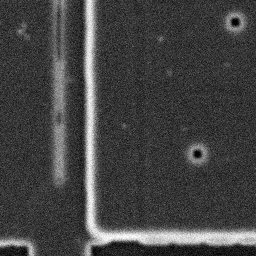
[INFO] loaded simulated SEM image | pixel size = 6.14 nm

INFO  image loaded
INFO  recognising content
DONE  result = wiring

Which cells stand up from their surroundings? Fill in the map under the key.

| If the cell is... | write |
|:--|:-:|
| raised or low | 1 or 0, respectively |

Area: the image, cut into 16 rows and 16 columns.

0000001111111111
0000001111111111
0000001111111111
0000011111111111
0000011111111111
0000001111111111
0000001111111111
0000001111111111
0000001111111111
0000001111111111
0000001111111111
0000001111111111
0000001111111111
0000001111111111
0000001111111111
0000000000000000